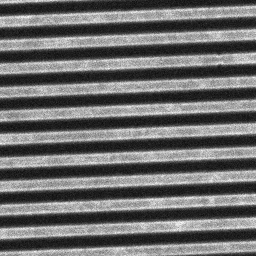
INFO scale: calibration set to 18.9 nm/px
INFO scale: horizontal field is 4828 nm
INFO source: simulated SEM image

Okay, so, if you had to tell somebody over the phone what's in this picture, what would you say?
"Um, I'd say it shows parallel lines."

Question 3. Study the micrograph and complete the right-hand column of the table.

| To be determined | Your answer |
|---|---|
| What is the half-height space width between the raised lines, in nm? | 231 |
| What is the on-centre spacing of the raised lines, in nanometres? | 444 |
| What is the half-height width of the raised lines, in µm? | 0.212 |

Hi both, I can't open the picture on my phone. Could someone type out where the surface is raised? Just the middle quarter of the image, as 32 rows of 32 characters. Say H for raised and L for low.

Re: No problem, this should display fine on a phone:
HHHHHHHHHHHHHHHHHHHHHHHHHHHHHHHH
HHHHHHLHHHHHLLLLLLLLLLLLLLLLLLLL
LLLLLLLLLLLLLLLLLLLLLLLLLLLLLLLL
LLLLLLLLLLLLLLLLLLLLLLLLLLLLLLLL
LLLLLLLLLLLLHHLLLLHHHHHHHHHHHHHH
HHHHHHHHHHHHHHHHHHHHHHHHHHHHHHHH
HHHHHHHHHHHHHHHHHHHHHHHHHHHHHHHH
HHHHHHHHLLLLLLLLLLLLLLLLLLLLLLLL
LLLLLLLLLLLLLLLLLLLLLLLLLLLLLLLL
LLLLLLLLLLLLLLLLLLLLLLLLLLLLLLLL
LLLLLLLLLLLLLLLHHHHHHHHHHHHHHHHH
HHHHHHHHHHHHHHHHHHHHHHHHHHHHHHHH
HHHHHHHHHHHHHHHHHHHHHHHHHHHHHLLL
HHHHHLLLLLLLLLLLLLLLLLLLLLLLLLLL
LLLLLLLLLLLLLLLLLLLLLLLLLLLLLLLL
LLLLLLLLLLLLLLLLLLLLLLLLLLLLLHHH
LLLLLLHHHHHHHHHHHHHHHHHHHHHHHHHH
HHHHHHHHHHHHHHHHHHHHHHHHHHHHHHHH
HHHHHHHHHHHHHHHHHHHHHHHHHLLLLLLL
HHLLLLLLLLLLLLLLLLLLLLLLLLLLLLLL
LLLLLLLLLLLLLLLLLLLLLLLLLLLLLLLL
LLLLLLLLLLLLLLLLLLLLLLLLLLLLLLLL
LLLLLLLLHHHHHHHHHHHHHHHHHHHHHHHH
HHHHHHHHHHHHHHHHHHHHHHHHHHHHHHHH
HHHHHHHHHHHHHHHHHHHHHHLLLLLLLLLL
LLLLLLLLLLLLLLLLLLLLLLLLLLLLLLLL
LLLLLLLLLLLLLLLLLLLLLLLLLLLLLLLL
LLLLLLLLLLLLLLLLLLLLLLLLLLLLLHHH
LLLLLHHHHHHHHHHHHHHHHHHHHHHHHHHH
HHHHHHHHHHHHHHHHHHHHHHHHHHHHHHHH
HHHHHHHHHHHHHHHHHHHLLLLLLLLLLLLL
LLLLLLLLLLLLLLLLLLLLLLLLLLLLLLLL